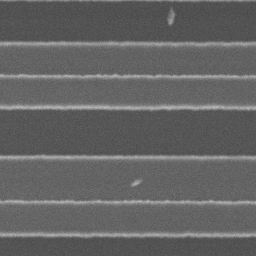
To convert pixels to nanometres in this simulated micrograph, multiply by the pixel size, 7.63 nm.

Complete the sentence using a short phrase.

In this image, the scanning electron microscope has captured lines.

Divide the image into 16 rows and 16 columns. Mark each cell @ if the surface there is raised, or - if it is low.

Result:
----------------
----------------
----------------
@@@@@@@@@@@@@@@@
@@@@@@@@@@@@@@@@
@@@@@@@@@@@@@@@@
@@@@@@@@@@@@@@@@
----------------
----------------
----------------
@@@@@@@@@@@@@@@@
@@@@@@@@@@@@@@@@
@@@@@@@@@@@@@@@@
@@@@@@@@@@@@@@@@
@@@@@@@@@@@@@@@@
----------------